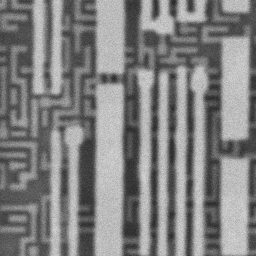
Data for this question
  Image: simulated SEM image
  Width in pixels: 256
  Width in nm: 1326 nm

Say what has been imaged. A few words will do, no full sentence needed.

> wiring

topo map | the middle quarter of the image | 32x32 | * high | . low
........*******.................
........*******..............*..
...................***..**...*..
...................***..**...*..
...................***..**..***.
........*******....***..**..***.
........*******.....*...**..***.
........*******....**...**..***.
........*******....**...**..**..
........*******....**...**..**..
........*******....**...**..**..
........*******....**...**..**..
........*******....**...**..**..
........*******....**...**..**..
........*******....**...**..**..
........*******....**...**..**..
****....*******....**...**..**..
****....*******....**...**..**..
*****...******.....**...**..**..
*****...******.....**...**..***.
.**.....******.....**...**..**..
.**.....*******....***..**..**..
.**.....*******....***..**..**..
.**.....*******....**...**..**..
.**.....*******....**...**..**..
.**.....*******....**...**..**..
..*.....*******....**...**..**..
..*.....*******....**...**..**..
.**.....*******....**...**..**..
.**.....*******....**...**..**..
.**.....*******....**...**..**..
.**.....*******....**...**..**..